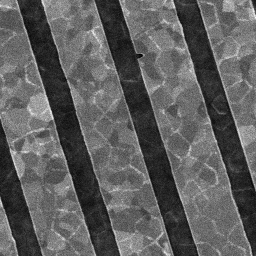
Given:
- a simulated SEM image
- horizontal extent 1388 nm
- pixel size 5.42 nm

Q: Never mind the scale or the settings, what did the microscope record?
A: one or a few lines or trenches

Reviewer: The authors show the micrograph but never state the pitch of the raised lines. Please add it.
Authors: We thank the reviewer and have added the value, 404 nanometers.